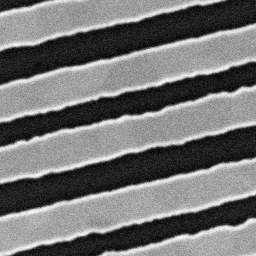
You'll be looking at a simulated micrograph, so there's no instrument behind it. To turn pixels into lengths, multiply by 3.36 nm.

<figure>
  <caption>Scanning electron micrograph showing lines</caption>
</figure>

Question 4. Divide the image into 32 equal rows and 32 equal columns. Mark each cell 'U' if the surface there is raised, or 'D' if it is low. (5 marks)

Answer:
DDDDDUUUUUUUUUUUUUUUUUUUUUDDDDDD
DUUUUUUUUUUUUUUUUUUUUDDDDDDDDDDD
UUUUUUUUUUUUUUUUUDDDDDDDDDDDDDDD
UUUUUUUUUUUUUDDDDDDDDDDDDDDDDDUU
UUUUUUUUDDDDDDDDDDDDDDDDDDUUUUUU
UUUUUDDDDDDDDDDDDDDDDDUUUUUUUUUU
DDDDDDDDDDDDDDDDDUUUUUUUUUUUUUUU
DDDDDDDDDDDDDUUUUUUUUUUUUUUUUUUU
DDDDDDDDDUUUUUUUUUUUUUUUUUUUDDDD
DDDDDUUUUUUUUUUUUUUUUUUUDDDDDDDD
DUUUUUUUUUUUUUUUUUUUDDDDDDDDDDDD
UUUUUUUUUUUUUUUDDDDDDDDDDDDDDUUU
UUUUUUUUUUUDDDDDDDDDDDDDDUUUUUUU
UUUUUUUUDDDDDDDDDDDDDUUUUUUUUUUU
UUUDDDDDDDDDDDDDDUUUUUUUUUUUUUUU
DDDDDDDDDDDDUUUUUUUUUUUUUUUUUUUU
DDDDDDDUUUUUUUUUUUUUUUUUUUUUDDDD
DDDDUUUUUUUUUUUUUUUUUUUUDDDDDDDD
UUUUUUUUUUUUUUUUUUUDDDDDDDDDDDDD
UUUUUUUUUUUUUUUDDDDDDDDDDDDDDDDD
UUUUUUUUUUUDDDDDDDDDDDDDDDDDUUUU
UUUUUUUDDDDDDDDDDDDDDDDDDUUUUUUU
UUDDDDDDDDDDDDDDDDDDUUUUUUUUUUUU
DDDDDDDDDDDDDDDDUUUUUUUUUUUUUUUU
DDDDDDDDDDDUUUUUUUUUUUUUUUUUUUUD
DDDDDDDUUUUUUUUUUUUUUUUUUUUDDDDD
DDDUUUUUUUUUUUUUUUUUUUUUDDDDDDDD
UUUUUUUUUUUUUUUUUUUDDDDDDDDDDDDU
UUUUUUUUUUUUUUUDDDDDDDDDDDDUUUUU
UUUUUUUUUUDDDDDDDDDDDDDUUUUUUUUU
UUUUUDDDDDDDDDDDDDDUUUUUUUUUUUUU
UUDDDDDDDDDDDDUUUUUUUUUUUUUUUUUU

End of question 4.